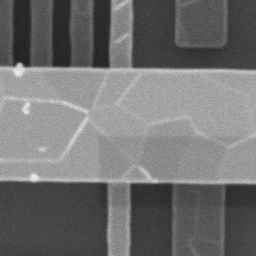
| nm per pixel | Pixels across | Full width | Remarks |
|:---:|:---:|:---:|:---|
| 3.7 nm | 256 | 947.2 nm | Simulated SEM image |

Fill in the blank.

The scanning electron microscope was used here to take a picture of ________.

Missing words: wiring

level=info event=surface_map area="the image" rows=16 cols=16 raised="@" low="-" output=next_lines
----------------
----------------
----------------
----------------
@@@@@@@@@@@@@@@@
@@@@@@@@@@@@@@@@
@@@@@@@@@@@@@@@@
@@@@@@@@@@@@@@@@
@@@@@@@@@@@@@@@@
@@@@@@@@@@@@@@@@
@@@@@@@@@@@@@@@@
----------------
----------------
----------------
----------------
----------------